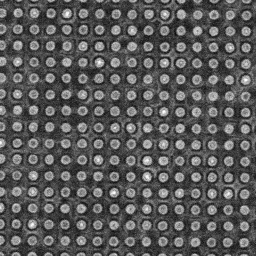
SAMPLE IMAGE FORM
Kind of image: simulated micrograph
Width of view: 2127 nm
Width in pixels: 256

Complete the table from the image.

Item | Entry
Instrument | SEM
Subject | a regular array of raised bodies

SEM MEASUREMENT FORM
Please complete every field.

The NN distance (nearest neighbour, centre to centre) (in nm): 133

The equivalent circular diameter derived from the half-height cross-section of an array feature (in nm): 73.8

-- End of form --